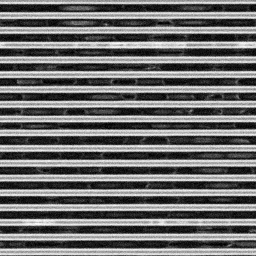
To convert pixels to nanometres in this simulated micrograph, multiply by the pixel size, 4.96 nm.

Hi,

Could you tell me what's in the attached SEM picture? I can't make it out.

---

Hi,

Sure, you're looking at parallel lines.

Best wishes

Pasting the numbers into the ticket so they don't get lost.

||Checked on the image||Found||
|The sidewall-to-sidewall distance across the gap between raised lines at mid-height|9.88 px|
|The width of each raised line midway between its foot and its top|0.0248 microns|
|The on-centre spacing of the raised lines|73.3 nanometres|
